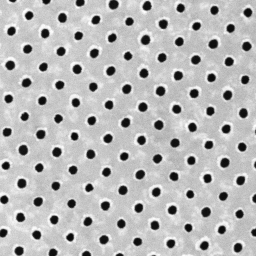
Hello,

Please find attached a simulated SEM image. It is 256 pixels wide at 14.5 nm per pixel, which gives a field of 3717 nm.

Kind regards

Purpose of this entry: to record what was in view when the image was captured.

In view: a regular array of holes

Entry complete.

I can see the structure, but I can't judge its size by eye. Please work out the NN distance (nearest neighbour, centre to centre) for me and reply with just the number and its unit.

340 nm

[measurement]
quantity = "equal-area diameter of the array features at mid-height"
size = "135 nm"